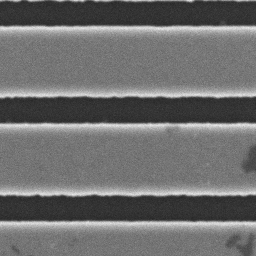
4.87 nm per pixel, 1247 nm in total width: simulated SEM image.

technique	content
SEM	lines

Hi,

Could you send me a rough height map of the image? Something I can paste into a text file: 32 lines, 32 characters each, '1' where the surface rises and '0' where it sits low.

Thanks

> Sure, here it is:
00000000000000000000000000000000
00000000000000000000000000000000
00000000000000000000000000000000
11111111111111111111111111111111
11111111111111111111111111111111
11111111111111111111111111111111
11111111111111111111111111111111
11111111111111111111111111111111
11111111111111111111111111111111
11111111111111111111111111111111
11111111111111111111111111111111
11111111111111111111111111111111
00000000000000000000000000000000
00000000000000000000000000000000
00000000000000000000000000000000
00010000001010000010100111100110
11111111111111111111111111111111
11111111111111111111111111111111
11111111111111111111111111111111
11111111111111111111111111111111
11111111111111111111111111111111
11111111111111111111111111111111
11111111111111111111111111111111
11111111111111111111111111111111
00000000010000001000000000000000
00000000000000000000000000000000
00000000000000000000000000000000
00000000000000000000000000000000
11111111111111111111111111111111
11111111111111111111111111111111
11111111111111111111111111111111
11111111111111111111111111111111